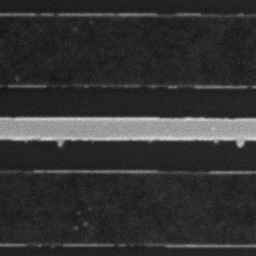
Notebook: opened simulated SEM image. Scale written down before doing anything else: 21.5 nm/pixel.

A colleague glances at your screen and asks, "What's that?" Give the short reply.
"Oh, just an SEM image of lines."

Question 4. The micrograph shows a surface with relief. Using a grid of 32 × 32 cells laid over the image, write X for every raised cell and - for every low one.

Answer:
--------------------------------
--------------------------------
XXXXXXXXXXXXXXXXXXXXXXXXXXXXXXXX
XXXXXXXXXXXXXXXXXXXXXXXXXXXXXXXX
XXXXXXXXXXXXXXXXXXXXXXXXXXXXXXXX
XXXXXXXXXXXXXXXXXXXXXXXXXXXXXXXX
XXXXXXXXXXXXXXXXXXXXXXXXXXXXXXXX
XXXXXXXXXXXXXXXXXXXXXXXXXXXXXXXX
XXXXXXXXXXXXXXXXXXXXXXXXXXXXXXXX
XXXXXXXXXXXXXXXXXXXXXXXXXXXXXXXX
XXXXXXXXXXXXXXXXXXXXXXXXXXXXXXXX
--------------------------------
--------------------------------
--------------------------------
--------------------------------
XXXXXXXXXXXXXXXXXXXXXXXXXXXXXXXX
XXXXXXXXXXXXXXXXXXXXXXXXXXXXXXXX
-------X---------------------XX-
--------------------------------
--------------------------------
--------------------------------
-X------------------------------
XXXXXXXXXXXXXXXXXXXXXXXXXXXXXXXX
XXXXXXXXXXXXXXXXXXXXXXXXXXXXXXXX
XXXXXXXXXXXXXXXXXXXXXXXXXXXXXXXX
XXXXXXXXXXXXXXXXXXXXXXXXXXXXXXXX
XXXXXXXXXXXXXXXXXXXXXXXXXXXXXXXX
XXXXXXXXXXXXXXXXXXXXXXXXXXXXXXXX
XXXXXXXXXXXXXXXXXXXXXXXXXXXXXXXX
XXXXXXXXXXXXXXXXXXXXXXXXXXXXXXXX
XXXXXXXXXXXXXXXXXXXXXXXXXXXXXXXX
--------------------------------